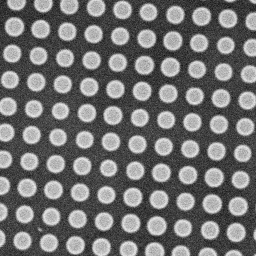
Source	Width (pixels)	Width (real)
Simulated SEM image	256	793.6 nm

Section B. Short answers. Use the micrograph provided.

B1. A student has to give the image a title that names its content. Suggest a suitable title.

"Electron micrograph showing an array of small figures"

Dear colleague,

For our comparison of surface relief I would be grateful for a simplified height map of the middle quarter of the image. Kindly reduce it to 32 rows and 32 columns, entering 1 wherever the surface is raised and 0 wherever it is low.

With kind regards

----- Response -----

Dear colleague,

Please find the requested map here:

10000111000111100011110011111001
00000000000011000011110011111001
00000000000000000000000001110000
10000000000000000000000000000000
11000111000011000000000000000000
11001111000111100011100001100000
10001111000111100111110011110001
00000111000111000111110011110001
00000000000000000011100011110001
00000000000000000000000001100001
10000110000000000000000000000000
10001111000111000011000000000000
10001111001111000111100011100000
00001111001111000111100011100011
00000000000111000111100011110011
00000000000000000000000011100011
00000000000000000000000000000001
00001110000110000000000000000000
10011110001111000111000000000000
00011110001111001111000111100011
00001100001111001111000111100011
00000000000100000111000111100011
00000000000000000000000011000011
00001000000000000000000000000000
00011100001100000000000000000000
00011110011110001111000111000000
00011100011110001111001111000111
00001000001110001111001111000111
00000000000000000110000111000111
00000000000000000000000000000011
00011000000000000000000000000000
00111100011100001100000000000000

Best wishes